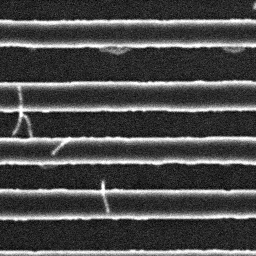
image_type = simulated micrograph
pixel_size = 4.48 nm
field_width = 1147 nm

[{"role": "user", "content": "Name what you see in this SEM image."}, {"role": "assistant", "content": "lines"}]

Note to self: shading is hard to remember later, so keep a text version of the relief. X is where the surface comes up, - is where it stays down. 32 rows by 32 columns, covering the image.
--------------------------------
--------------------------------
-----------------------------XXX
XXXXXXXXXXXXXXXXXXXXXXXXXXXXXXXX
XXXXXXXXXXXXXXXXXXXXXXXXXXXXXXXX
XXXXXXXXXXXXXXXXXXXXXXXXXXXXXXXX
--------------------------------
--------------------------------
--------------------------------
--------------------------------
XXXXXXXXXXXXXXXXXXXXXXXXXXXXXXXX
XXXXXXXXXXXXXXXXXXXXXXXXXXXXXXXX
XXXXXXXXXXXXXXXXXXXXXXXXXXXXXXXX
XXXXXXXXXXXXXXXXXXXXXXXXXXXXXXXX
--------------------------------
--------------------------------
--------------------------------
XXXXXXXXXXXXXXXXXXXXXXXXXXXXXXXX
XXXXXXXXXXXXXXXXXXXXXXXXXXXXXXXX
XXXXXXXXXXXXXXXXXXXXXXXXXXXXXXXX
----XX-------------------------X
--------------------------------
--------------------------------
--------------------------------
XXXXXXXXXXXXXXXXXXXXXXXXXXXXXXXX
XXXXXXXXXXXXXXXXXXXXXXXXXXXXXXXX
XXXXXXXXXXXXXXXXXXXXXXXXXXXXXXXX
--------------------------------
--------------------------------
--------------------------------
--------------------------------
XXXXXXXXXXXXXXXXXXXXXXXXXXXXXXXX